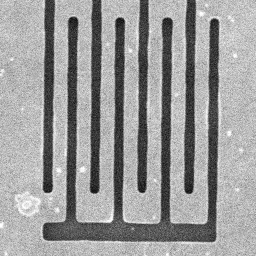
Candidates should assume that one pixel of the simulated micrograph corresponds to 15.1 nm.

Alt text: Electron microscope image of groups of lines, slits or small figures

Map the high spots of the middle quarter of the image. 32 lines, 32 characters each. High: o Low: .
o...ooo...oo...ooo...ooo...ooo..
o...ooo...oo...ooo...ooo...ooo..
o...ooo...oo...ooo...ooo...ooo..
o...ooo..ooo...ooo...ooo...ooo..
o...ooo..oooo..ooo...ooo...ooo..
o...ooo..ooo...ooo...ooo...ooo..
o...ooo..ooo...ooo...ooo...ooo..
o...ooo..ooo...ooo...ooo...ooo..
o...ooo..ooo...ooo...ooo...ooo..
o...ooo..oooo..ooo...ooo...ooo..
o...ooo..oooo..ooo...ooo...ooo..
o..oooo..oooo..ooo...ooo...ooo..
o..oooo..ooo...ooo...ooo...ooo..
o..oooo..ooo...ooo...ooo...ooo..
o..oooo..ooo...ooo...ooo...ooo..
o...ooo..ooo...ooo...ooo...ooo..
o...oo...ooo...ooo...ooo...ooo..
o...oo...ooo...ooo...ooo...ooo..
o...oo...ooo...ooo...ooo...ooo..
o...oo...ooo...ooo...ooo...ooo..
....oo...ooo...ooo...ooo...ooo..
...oooo..ooo...ooo...ooo...ooo..
...ooo...ooo...ooo...ooo...ooo..
...ooo...ooo...ooo...ooo...ooo..
...ooo...ooo...ooo...ooo...ooo..
...ooo...ooo...ooo...ooo...ooo..
...ooo...ooo...ooo...ooo...ooo..
...ooo...ooo...ooo...ooo...ooo..
...ooo...ooo...ooo...ooo...ooo..
...ooo...ooo...ooo...ooo...ooo..
...ooo...ooo...ooo...ooo...ooo..
...ooo...ooo...ooo...ooo...ooo..